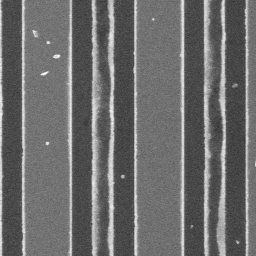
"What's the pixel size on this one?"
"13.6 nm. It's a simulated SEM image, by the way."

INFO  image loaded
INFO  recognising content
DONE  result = lines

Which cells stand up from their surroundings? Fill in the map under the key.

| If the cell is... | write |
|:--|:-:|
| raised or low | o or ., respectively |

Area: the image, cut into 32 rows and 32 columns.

...oooooo...oo...oooooo...oo...o
...oooooo...oo...oooooo...oo...o
...oooooo...oo...oooooo...oo...o
...oooooo...oo...oooooo...oo...o
...oooooo...oo...oooooo...oo...o
...oooooo...oo...oooooo...oo...o
...oooooo...oo...oooooo...oo...o
...oooooo...oo...oooooo...oo...o
...oooooo...oo...oooooo...oo...o
...oooooo...oo...oooooo...oo...o
...oooooo...oo...oooooo...oo...o
...oooooo...oo...oooooo...oo...o
...oooooo...oo...oooooo...oo...o
...oooooo...oo...oooooo...oo...o
...oooooo...oo...oooooo...oo...o
...oooooo...oo...oooooo...oo...o
...oooooo...oo...oooooo...oo...o
...oooooo...oo...oooooo...oo...o
...oooooo...oo...oooooo...oo...o
...oooooo...oo...oooooo...oo...o
...oooooo...oo...oooooo...oo...o
...oooooo...oo...oooooo...oo...o
...oooooo...oo...oooooo...oo...o
...oooooo...oo...oooooo...oo...o
...oooooo...oo...oooooo...oo...o
...oooooo...oo...oooooo...oo...o
...oooooo...oo...oooooo...oo...o
...oooooo...oo...oooooo...oo...o
...oooooo...oo...oooooo...oo...o
...oooooo...oo...oooooo...oo...o
...oooooo...oo...oooooo...oo...o
...oooooo...oo...oooooo...oo...o